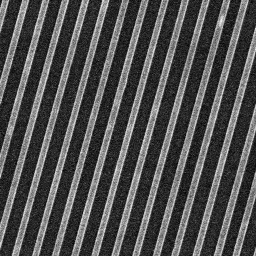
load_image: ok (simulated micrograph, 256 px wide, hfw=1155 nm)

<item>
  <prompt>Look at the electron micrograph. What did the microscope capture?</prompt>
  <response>parallel lines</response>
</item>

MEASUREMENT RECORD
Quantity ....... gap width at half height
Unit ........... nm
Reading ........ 58.1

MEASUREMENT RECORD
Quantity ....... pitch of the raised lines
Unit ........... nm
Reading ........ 87.3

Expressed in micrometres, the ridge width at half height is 0.0272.